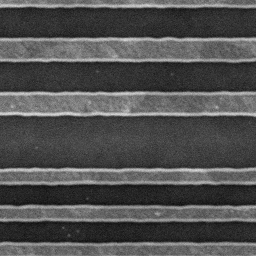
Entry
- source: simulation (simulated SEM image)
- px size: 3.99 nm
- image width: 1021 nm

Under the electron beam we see groups of lines, slits or small figures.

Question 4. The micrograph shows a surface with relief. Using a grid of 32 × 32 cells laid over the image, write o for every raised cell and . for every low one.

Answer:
oooooooooooooooooooooooooooooooo
................................
................................
................................
................................
oooooooooooooooooooooooooooooooo
oooooooooooooooooooooooooooooooo
.ooo.o..........oo...ooooooooooo
................................
................................
................................
................................
oooooooooooooooooooooooooooooooo
oooooooooooooooooooooooooooooooo
................................
................................
................................
................................
................................
................................
................................
oooooooooooooooooooooooooooooooo
oooooooooooooooooooooooooooooooo
................................
................................
................................
oooooooooooooooooooooooooooooooo
ooooo...ooooooooooooooooooooo.oo
................................
................................
oooooooooo...ooooooooooooooooooo
oooooooooooooooooooooooooooooooo